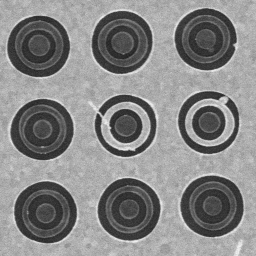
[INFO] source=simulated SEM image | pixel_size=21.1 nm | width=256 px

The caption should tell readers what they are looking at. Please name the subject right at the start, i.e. an array of small figures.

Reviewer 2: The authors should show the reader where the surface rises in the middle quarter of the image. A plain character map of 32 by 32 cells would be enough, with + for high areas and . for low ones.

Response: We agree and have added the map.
+++++++++.....++....+++++++++++.
++++++++++.........+++++++++++++
+++++++++++++...++++++++++++++++
++++++++++++++++++++++++++++++++
++++++++++++++++++++++++++++++++
++++++++++++++++++++++++++++++++
++++++++++++++++++++++++++++++++
++++++++++++++.+++++++++++++++++
+++++++++++........++++++++++++.
++++++++++...........+++++++++..
+++++++++...++++++....+++++++...
.++++++++..+++...+++...++++++..+
..++++++..++.......++..++++++..+
..++++++..++..+++..++..+++++..++
...++++..++..+++++..+..+++++..++
...++++..++..+++++..+..+++++...+
...+++++..+..+++++..+..++++++..+
..++++++..++..+++..++..++++++..+
..++++++..++.......++..+++++++..
..+++++++..++....+++..++++++++..
.++++++++...+++++++...+++++++++.
.+++++++++......+...++++++++++++
++++++++++++.......+++++++++++++
+++++++++++++++.++++++++++++++++
++++++++++++++++++++++++++++++++
++++++++++++++++++++++++++++++++
++++++++++++++++++++++++++++++++
++++++++++++++++++++++++++++++++
++++++++++++++...+++++++++++++++
++++++++++++........++++++++++++
+++++++++++..........++++++++++.
.+++++++++...+++++++...+++++++..